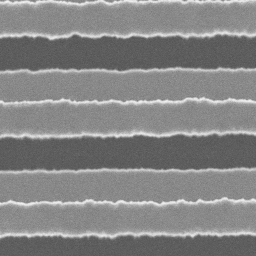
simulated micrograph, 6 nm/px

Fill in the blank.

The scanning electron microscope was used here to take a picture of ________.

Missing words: lines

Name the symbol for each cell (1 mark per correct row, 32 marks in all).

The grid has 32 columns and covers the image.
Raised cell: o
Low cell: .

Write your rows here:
oooooooooooooooooooooooooooooooo
oooooooooooooooooooooooooooooooo
oooooooooooooooooooooooooooooooo
oooooooooooooooooooooooooooooooo
o...ooooo..oo.ooo.o....o........
................................
................................
................................
................................
oooooooooooooooooooooooooooooooo
oooooooooooooooooooooooooooooooo
oooooooooooooooooooooooooooooooo
oooooooooooooooooooooooooooooooo
oooooooooooooooooooooooooooooooo
oooooooooooooooooooooooooooooooo
oooooooooooooooooooooooooooooooo
oooooooooooooooooooooooooooooooo
................................
................................
................................
................................
..oooooooooooooooooooooooooooooo
oooooooooooooooooooooooooooooooo
oooooooooooooooooooooooooooooooo
oooooooooooooooooooooooooooooooo
oooooooooooooooooooooooooooooooo
oooooooooooooooooooooooooooooooo
oooooooooooooooooooooooooooooooo
oooooooooooooooooooooooooooooooo
o.......oo..ooo.................
................................
................................